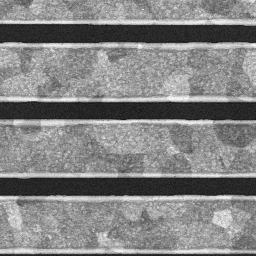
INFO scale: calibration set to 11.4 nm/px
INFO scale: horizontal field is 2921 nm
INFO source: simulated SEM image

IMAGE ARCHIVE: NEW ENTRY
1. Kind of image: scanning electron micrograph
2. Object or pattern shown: lines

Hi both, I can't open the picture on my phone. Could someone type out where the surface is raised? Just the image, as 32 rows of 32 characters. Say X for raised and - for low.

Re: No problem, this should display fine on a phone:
XXXXXXXXXXXXXXXXXXXXXXXXXXXXXXXX
XXXXXXXXXXXXXXXXXXXXXXXXXXXXXXXX
XXXXXXXXXXXXXXXXXXXXXXXXXXXXXXXX
--------------------------------
--------------------------------
XXXX-XXXXXXXXXXXXXXXXX-XXXXXXXXX
XXXXXXXXXXXXXXXXXXXXXXXXXXXXXXXX
XXXXXXXXXXXXXXXXXXXXXXXXXXXXXXXX
XXXXXXXXXXXXXXXXXXXXXXXXXXXXXXXX
XXXXXXXXXXXXXXXXXXXXXXXXXXXXXXXX
XXXXXXXXXXXXXXXXXXXXXXXXXXXXXXXX
XXXXXXXXXXXXXXXXXXXXXXXXXXXXXXXX
XXXXXXXXXXXXXXXXXXXXXXXXXXXXXXXX
--------------------------------
--------------------------------
XXXXXXXXXXXXXXXXXXXXXXXXXXXXXXXX
XXXXXXXXXXXXXXXXXXXXXXXXXXXXXXXX
XXXXXXXXXXXXXXXXXXXXXXXXXXXXXXXX
XXXXXXXXXXXXXXXXXXXXXXXXXXXXXXXX
XXXXXXXXXXXXXXXXXXXXXXXXXXXXXXXX
XXXXXXXXXXXXXXXXXXXXXXXXXXXXXXXX
XXXXXXXXXXXXXXXXXXXXXXXXXXXXXXXX
--------------------------------
--------------------------------
--------------------------------
XXXXXXXXXXXXXXXXXXXXXXXXXXXXXXXX
XXXXXXXXXXXXXXXXXXXXXXXXXXXXXXXX
XXXXXXXXXXXXXXXXXXXXXXXXXXXXXXXX
XXXXXXXXXXXXXXXXXXXXXXXXXXXXXXXX
XXXXXXXXXXXXXXXXXXXXXXXXXXXXXXXX
XXXXXXXXXXXXXXXXXXXXXXXXXXXXXXXX
XXXXXXXXXXXXXXXXXXXXXXXXXXXXXXXX